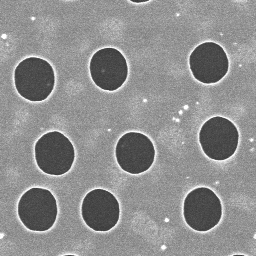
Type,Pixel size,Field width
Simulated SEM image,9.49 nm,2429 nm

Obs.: a regular array of holes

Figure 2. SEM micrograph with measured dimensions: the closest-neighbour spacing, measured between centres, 0.692 microns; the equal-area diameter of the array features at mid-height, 391 nanometres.